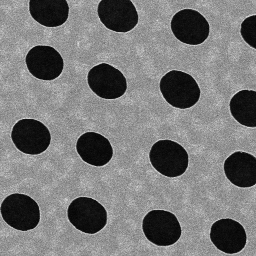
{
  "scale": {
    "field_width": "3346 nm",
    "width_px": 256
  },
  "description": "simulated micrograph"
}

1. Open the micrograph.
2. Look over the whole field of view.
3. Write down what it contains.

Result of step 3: a regular array of holes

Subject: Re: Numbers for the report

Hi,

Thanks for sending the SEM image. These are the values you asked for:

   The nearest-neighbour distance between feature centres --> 65.3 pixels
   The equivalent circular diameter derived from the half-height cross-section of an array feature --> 487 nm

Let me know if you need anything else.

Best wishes